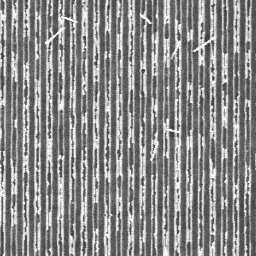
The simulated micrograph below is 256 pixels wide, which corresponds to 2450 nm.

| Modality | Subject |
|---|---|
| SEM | parallel lines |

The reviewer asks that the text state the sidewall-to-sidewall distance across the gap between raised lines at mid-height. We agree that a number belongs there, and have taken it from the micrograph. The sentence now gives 5.62 pixels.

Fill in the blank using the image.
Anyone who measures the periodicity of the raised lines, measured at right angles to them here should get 112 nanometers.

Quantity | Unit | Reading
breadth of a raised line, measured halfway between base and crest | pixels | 5.62